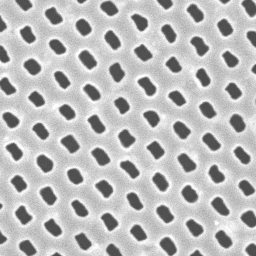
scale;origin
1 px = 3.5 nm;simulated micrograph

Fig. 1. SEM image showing a regular array of holes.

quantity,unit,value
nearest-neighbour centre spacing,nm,110